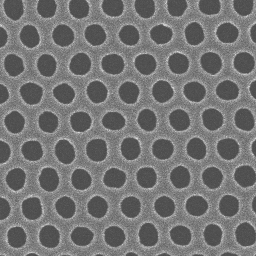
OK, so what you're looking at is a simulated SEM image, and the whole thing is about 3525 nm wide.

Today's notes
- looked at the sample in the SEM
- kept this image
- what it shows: a regular array of holes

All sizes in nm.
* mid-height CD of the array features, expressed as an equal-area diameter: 295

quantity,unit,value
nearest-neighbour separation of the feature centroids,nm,442